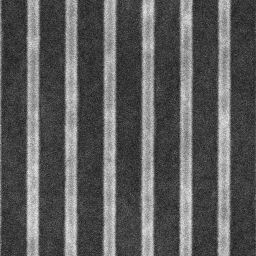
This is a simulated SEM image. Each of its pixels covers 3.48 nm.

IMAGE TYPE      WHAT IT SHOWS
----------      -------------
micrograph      parallel lines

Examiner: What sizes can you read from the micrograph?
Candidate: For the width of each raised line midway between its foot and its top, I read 39.6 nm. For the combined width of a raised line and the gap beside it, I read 0.133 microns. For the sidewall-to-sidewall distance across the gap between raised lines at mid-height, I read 94.9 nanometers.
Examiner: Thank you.